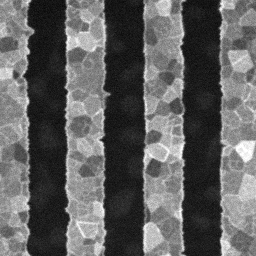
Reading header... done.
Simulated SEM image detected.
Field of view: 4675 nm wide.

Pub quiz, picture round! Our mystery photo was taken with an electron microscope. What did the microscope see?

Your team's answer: one or a few lines or trenches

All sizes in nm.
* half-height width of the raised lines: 673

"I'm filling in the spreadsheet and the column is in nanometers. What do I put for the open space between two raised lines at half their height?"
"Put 719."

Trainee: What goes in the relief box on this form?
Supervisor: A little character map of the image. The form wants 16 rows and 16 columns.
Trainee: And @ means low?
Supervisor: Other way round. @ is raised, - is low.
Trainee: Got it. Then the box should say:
@@--@@---@@---@@
@@--@@@--@@---@@
@@--@@@--@@---@@
@@--@@---@@---@@
@@--@@@--@@---@@
@@--@@@--@@---@@
@@--@@---@@---@@
@@--@@---@@---@@
@@--@@---@@---@@
@@--@@---@@---@@
@@--@@---@@---@@
@@--@@---@@---@@
@@--@@---@@---@@
@@--@@---@@---@@
@@--@@@--@@---@@
@@--@@---@@---@@